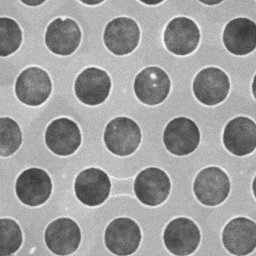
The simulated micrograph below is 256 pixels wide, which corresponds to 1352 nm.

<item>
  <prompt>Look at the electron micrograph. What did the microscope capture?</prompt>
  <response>a regular array of holes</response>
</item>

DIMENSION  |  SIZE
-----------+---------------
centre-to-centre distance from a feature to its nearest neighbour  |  307 nanometres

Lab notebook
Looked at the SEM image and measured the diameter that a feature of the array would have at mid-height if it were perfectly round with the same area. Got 203 nm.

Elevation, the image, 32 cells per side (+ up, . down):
+++..++++++.++++++..+++++..+++++
++++++++++++++++++++++++++++++++
..+++++..+++++...++++...+++++..+
...+++....+++....++++....+++....
...+++....+++.....++.....+++....
...+++....+++....++++....+++....
..++++...+++++...++++...+++++..+
++++++++++++++++++++++++++++++++
+++..++++++.++++++..++++++.+++++
++....++++....+++....+++....++++
++....+++.....+++....+++.....++.
++....+++.....+++....+++.....++.
++....++++...++++....++++...++++
++++++++++++++++++++++++++++++++
++++++++++++++++++++++++++++++++
..++++....+++....++++...++++....
...+++....+++.....++.....+++....
...+++....+++.....++.....+++....
..++++....+++....++++....+++....
.++++++++++++++.++++++++++++++++
++++++++++++++++++++++++++++++++
+++...++++...++++....++++...++++
++....+++............+++.....+++
++.....++............+++.....++.
++....++++....++.....+++....++++
+++..+++++...+++++..+++++...++++
++++++++++++++++++++++++++++++++
..+++++..+++++...++++...+++++..+
...+++....+++.....+++....+++....
...+++....+++.....++.....+++....
...+++....+++.....+++....+++....
..+++++..+++++...++++...+++++...